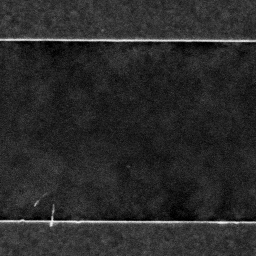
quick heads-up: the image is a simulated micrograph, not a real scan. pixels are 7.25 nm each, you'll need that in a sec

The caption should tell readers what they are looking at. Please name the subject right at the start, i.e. one or a few lines or trenches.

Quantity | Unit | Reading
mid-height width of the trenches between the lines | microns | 1.31